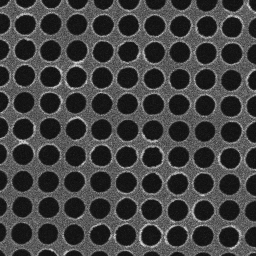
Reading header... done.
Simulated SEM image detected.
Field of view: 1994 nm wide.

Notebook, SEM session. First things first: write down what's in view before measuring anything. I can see a regular array of holes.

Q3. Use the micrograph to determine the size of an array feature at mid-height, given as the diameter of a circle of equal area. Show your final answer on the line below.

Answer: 159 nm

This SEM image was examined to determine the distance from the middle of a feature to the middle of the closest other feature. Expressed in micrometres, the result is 0.199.